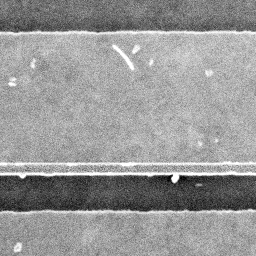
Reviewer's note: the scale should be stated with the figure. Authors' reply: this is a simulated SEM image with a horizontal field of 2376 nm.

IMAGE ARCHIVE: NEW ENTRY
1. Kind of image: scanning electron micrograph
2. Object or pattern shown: lines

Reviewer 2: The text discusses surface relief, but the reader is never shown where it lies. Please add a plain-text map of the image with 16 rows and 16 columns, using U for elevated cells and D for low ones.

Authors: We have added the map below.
DDDDDDDDDDDDDDDD
DDDDDDDDDDDDDDDD
UUUUUUUUUUUUUUUU
UUUUUUUUUUUUUUUU
UUUUUUUUUUUUUUUU
UUUUUUUUUUUUUUUU
UUUUUUUUUUUUUUUU
UUUUUUUUUUUUUUUU
UUUUUUUUUUUUUUUU
UUUUUUUUUUUUUUUU
UUUUUUUUUUUUUUUU
DDDDDDDDDDDDDDDD
DDDDDDDDDDDDDDDD
UUUUUUUUUUUUUUUU
UUUUUUUUUUUUUUUU
UUUUUUUUUUUUUUUU